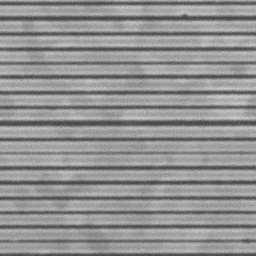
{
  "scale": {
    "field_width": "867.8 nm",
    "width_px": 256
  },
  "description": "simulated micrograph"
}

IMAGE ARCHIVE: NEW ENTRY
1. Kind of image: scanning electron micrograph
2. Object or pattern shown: parallel lines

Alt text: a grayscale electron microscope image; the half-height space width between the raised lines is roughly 17.8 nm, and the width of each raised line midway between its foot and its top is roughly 9.62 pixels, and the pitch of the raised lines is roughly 50.2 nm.